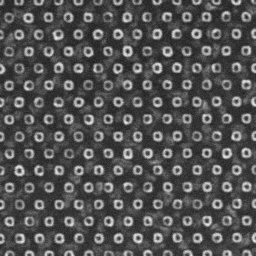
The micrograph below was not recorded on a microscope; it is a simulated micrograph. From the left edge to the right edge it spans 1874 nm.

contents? a regular array of raised bodies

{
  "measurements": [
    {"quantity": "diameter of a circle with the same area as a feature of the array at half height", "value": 67.1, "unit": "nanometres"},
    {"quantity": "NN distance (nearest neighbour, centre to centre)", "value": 19.2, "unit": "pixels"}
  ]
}